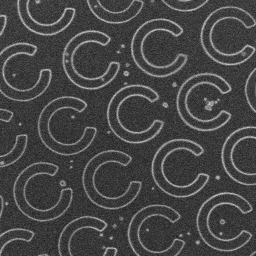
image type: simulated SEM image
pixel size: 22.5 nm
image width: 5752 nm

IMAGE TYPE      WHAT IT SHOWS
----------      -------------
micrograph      an array of small figures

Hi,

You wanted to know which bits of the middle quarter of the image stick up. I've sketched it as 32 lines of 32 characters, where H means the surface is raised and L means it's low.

HHLLLLLLLLLHHHLLLLLHHHHLLLHHHHLL
HHHLLLLLLLLHHHLLLLLLHHHHHHHHHLLL
LHHHLLLLLLHHHLLHLLLLLHHHHHHLLLLL
LHHHHLLLHHHHLLLLLLLLLLLLLLLLLLLL
LLHHHHHHHHHLLLLLLLLLLLLLLLLLLLHH
LLLLHHHHHHLLLLLLLHHHLLLLLLLLLHHH
LLLLLLLLLLLLLLHHHHHHHHLLLLLLLHHH
LLLLLLLLLLLLLHHHHHHHHHHLLLLLLHHL
HHHLLLLLLLLLHHHHLLLLLHHLLLLLHHHL
HHHHHLLLLLLLHHLLLLLLLLLLLLLLHHHL
HHHHHHLLLLLHHHLLLLLLLLLLLHLLHHHL
LLLHHLLLLLLHHLLLLLLLLLLLLLLLLHHL
LLLLLLLLLLLHHLLLLLLLLLLLLLLLLHHH
LLLLLLLLLLLHHLLLLLLLLLLLLLLLLHHH
LLLLLLLLLLLHHHLLLLLLLLLHLLLLLLHH
LLLLLLLLLLLLHHHLLLLLLLHHLLLLLLLL
LLLLLHHHLLLLHHHHLLLLLHHHLLLLLLLL
LLLLLHHHLLLLLHHHHHHHHHHLLLLLLLLL
LLLLHHHLLLLLLLHHHHHHHHLLLLLLLLLL
LLLHHHHLLLLLLLLLHHHLLLLLLLHHHHHH
HHHHHHLLLLLLLLLLLLLLLLLLLHHHHHHH
HHHHHLLLLLLLLLLLLLLLLLLLHHHHLLLH
HHLLLLLLLHHHHHHLLLLLLLLHHHLLLLLL
LLLLLLLHHHHHHHHHHLLLLLLHHLLLLLLL
LLLLLLHHHHHLLHHHLLLLLLHHHLLLLLLL
LLLLLLHHHLLLLLLLLLLLLLHHHLLLLLLL
LLLLLHHHLLLLLLLLLLLLLLHHHLLLLLLL
LLLLLHHHLLLLLLLLLLLLLLHHHLLLLLLL
LLLLLHHLLLLLLLLLLLLLLLLHHLLLLLLL
LLLLLHHLLLLLLLLLLHLLLLLHHHLLLLLL
LLLLLHHHLLLLLLLLHHHLLLLLHHHHLLHH
HHLLLHHHLLLLLLLLHHHLLLLLLHHHHHHH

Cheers